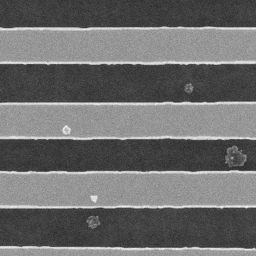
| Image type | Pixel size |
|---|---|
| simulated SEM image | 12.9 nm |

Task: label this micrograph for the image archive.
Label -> lines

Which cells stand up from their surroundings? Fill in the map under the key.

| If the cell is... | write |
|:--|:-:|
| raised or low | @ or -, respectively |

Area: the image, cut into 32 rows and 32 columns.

--------------------------------
--------------------------------
--------------------------------
--@@@@@@---@@@@@@@@@@@@@@@@@@@@@
@@@@@@@@@@@@@@@@@@@@@@@@@@@@@@@@
@@@@@@@@@@@@@@@@@@@@@@@@@@@@@@@@
@@@@@@@@@@@@@@@@@@@@@@@@@@@@@@@@
@@@@@@@@@@@@@@@@@@@@@@@@@@@@@@@@
--------------------------------
--------------------------------
--------------------------------
--------------------------------
--------------------------------
@@@@@@@@@@@@@@@@@@@@@@@@@@@@@@@@
@@@@@@@@@@@@@@@@@@@@@@@@@@@@@@@@
@@@@@@@@@@@@@@@@@@@@@@@@@@@@@@@@
@@@@@@@@@@@@@@@@@@@@@@@@@@@@@@@@
--------------------------------
--------------------------------
--------------------------------
--------------------------------
@@----@@---@@@@@@@@@@@@@@@@@@@@@
@@@@@@@@@@@@@@@@@@@@@@@@@@@@@@@@
@@@@@@@@@@@@@@@@@@@@@@@@@@@@@@@@
@@@@@@@@@@@@@@@@@@@@@@@@@@@@@@@@
@@@@@@@@@@@@@@@@@@@@@@@@@@@@@@@@
--------------------------------
--------------------------------
--------------------------------
--------------------------------
--------------------------------
@@@@@@@@@@@@@@@@@@@@@@@@@@@@@@@@